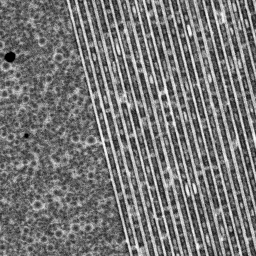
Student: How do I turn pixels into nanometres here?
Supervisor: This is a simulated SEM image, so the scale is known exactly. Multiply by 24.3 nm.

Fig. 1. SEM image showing parallel lines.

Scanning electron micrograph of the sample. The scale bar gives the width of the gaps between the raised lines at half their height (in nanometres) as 147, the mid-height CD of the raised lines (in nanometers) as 50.